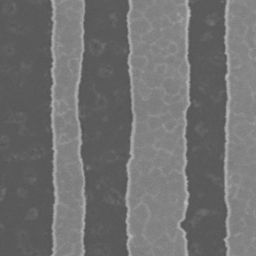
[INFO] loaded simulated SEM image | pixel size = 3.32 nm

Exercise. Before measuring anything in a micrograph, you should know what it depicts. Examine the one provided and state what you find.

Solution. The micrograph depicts one or a few lines or trenches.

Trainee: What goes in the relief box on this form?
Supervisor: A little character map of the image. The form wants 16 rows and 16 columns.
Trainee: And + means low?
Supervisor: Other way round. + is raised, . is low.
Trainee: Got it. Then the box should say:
...++...++++..++
...++...++++..++
...++...++++..++
...++...++++..++
...++...++++..++
...++...++++..++
...++...++++..++
...++...++++..++
...++...++++..++
...++...++++..++
...++...++++..++
...++...++++..++
....+...++++..++
...++...+++...++
...++...+++...++
...++...++++..++